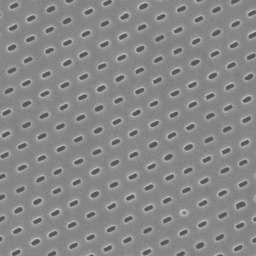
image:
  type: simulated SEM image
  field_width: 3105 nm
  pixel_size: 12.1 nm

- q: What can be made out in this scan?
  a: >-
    a regular array of holes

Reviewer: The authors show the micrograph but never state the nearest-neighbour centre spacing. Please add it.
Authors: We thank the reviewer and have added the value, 242 nanometers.